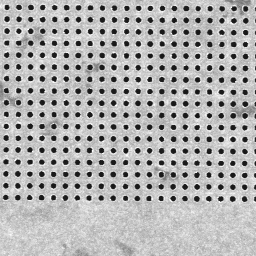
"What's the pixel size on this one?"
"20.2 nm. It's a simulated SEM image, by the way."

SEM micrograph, a regular array of holes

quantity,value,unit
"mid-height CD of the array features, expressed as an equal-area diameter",114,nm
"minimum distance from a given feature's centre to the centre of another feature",11.7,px